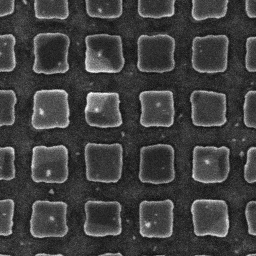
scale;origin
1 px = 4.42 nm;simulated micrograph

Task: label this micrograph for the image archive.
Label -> a regular array of raised bodies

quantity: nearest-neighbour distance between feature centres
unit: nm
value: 235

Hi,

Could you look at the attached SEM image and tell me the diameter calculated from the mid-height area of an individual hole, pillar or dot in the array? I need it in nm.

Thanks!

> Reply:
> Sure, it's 175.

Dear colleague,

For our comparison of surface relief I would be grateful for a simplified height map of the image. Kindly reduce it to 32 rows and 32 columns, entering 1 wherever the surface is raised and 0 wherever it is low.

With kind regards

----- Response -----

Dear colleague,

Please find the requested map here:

11001111000111100111110011110001
10001111000111100111110011110001
00000000000000000000000000000000
00000000000000000000000000000000
11001111000111000001100000110000
11001111100111100111110011111001
11001111000111100111110011110001
11001111000111110111110011110001
11001111000111100111110011110001
00000000000000000000000000000000
00000000000000000000000000000000
11000111000000000011100011100001
11001111000111100111110011110001
11001111100111100011110011110001
11001111100111100011110011110001
10001111100111100011100011110001
00000000000000000000000000000000
00000000000000000000000000000000
10001111000111100011100001110000
11001111000111100011110011111001
11001111000111100111110011111001
11001111000111100111110011111001
00001111000111100011110011110001
00000000000000000000000000000000
00000000000000000000000000000000
11001111000111100011110011110001
11001111000111100111110011110001
11001111000111100111110011110001
10001111000111100011110011110001
00001111000010000011100000010000
00000000000000000000000000000000
00000000000000000000000000000000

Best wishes